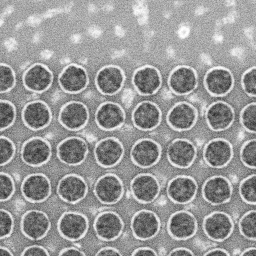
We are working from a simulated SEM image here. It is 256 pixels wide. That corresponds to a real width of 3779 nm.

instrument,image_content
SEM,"a regular array of raised bodies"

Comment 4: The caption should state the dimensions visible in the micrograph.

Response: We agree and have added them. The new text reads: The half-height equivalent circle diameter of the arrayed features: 0.415 µm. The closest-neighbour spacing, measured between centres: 528 nm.